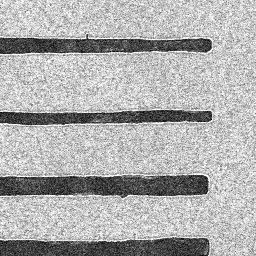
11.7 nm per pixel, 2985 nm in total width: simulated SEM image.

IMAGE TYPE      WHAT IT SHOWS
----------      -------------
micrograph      one or a few lines or trenches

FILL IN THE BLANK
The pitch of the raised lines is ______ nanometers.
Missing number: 792